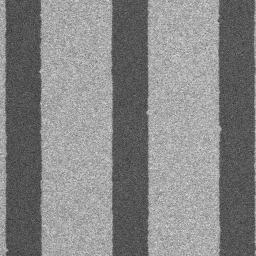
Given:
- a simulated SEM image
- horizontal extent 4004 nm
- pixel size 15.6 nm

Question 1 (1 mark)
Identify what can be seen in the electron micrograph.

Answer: one or a few lines or trenches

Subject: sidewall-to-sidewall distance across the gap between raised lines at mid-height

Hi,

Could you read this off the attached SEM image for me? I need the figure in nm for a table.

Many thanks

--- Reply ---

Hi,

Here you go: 569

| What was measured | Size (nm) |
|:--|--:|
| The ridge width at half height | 1100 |